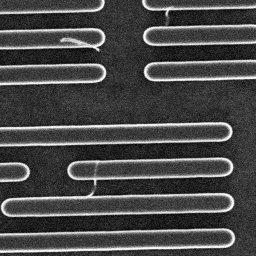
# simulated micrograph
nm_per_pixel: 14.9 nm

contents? groups of lines, slits or small figures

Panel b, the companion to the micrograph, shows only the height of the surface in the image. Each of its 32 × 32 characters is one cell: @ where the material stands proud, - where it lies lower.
@@@@@@@@@@@@@-----@@@@@@@@@@@@@@
@@@@@@@-------------------------
--------------------------------
---------------------@@@@@@@@@@@
@@@@@@@@@@@@@-----@@@@@@@@@@@@@@
@@@@@@@@@@@@@------@@@@@--------
--------------------------------
--------------------------------
@@@@@@@@@@@@@-----@@@@@@@@@@@@@@
@@@@@@@@@@@@@-----@@@@@@@@@@@@@@
--------------------------------
--------------------------------
--------------------------------
--------------------------------
--------------------------------
--------------------------@@----
@@@@@@@@@@@@@@@@@@@@@@@@@@@@@---
@@@@@@@@@@@@@@@@@@@@@@@@@@@@----
--------------------------------
--------------------------------
@@@------@@@@@@@@@@@@@@@@@@@@---
@@@@-----@@@@@@@@@@@@@@@@@@@@---
@@@--------@--------------------
--------------------------------
---------------@@@@@@@@@@@@@@---
@@@@@@@@@@@@@@@@@@@@@@@@@@@@@---
@@@@@@@@@@@@@@@@@@@@@@@@--------
--------------------------------
--------------------------------
@@@@@@@@@@@@@@@@@@@@@@@@@@@@@---
@@@@@@@@@@@@@@@@@@@@@@@@@@@@@---
--------------------------------